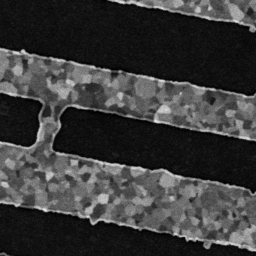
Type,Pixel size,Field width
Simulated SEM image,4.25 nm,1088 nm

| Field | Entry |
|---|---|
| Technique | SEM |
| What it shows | one or a few lines or trenches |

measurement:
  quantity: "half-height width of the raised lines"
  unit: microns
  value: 0.238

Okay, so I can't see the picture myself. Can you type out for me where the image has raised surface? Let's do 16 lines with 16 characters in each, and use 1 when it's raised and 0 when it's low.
0000000000111111
0000000000000001
0000000000000000
1100000000000000
1111111100000000
1111111111111000
0001111111111111
0011000001111111
0010000000000001
1111000000000000
1111111110000000
1111111111111100
1111111111111111
0000011111111111
0000000000111111
0000000000000001